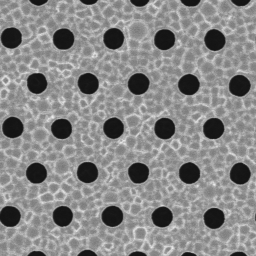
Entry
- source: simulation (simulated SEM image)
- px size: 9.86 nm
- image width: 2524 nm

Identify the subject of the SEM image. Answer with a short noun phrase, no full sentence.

a regular array of holes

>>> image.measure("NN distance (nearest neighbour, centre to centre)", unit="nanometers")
495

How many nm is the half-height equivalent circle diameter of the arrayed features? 211